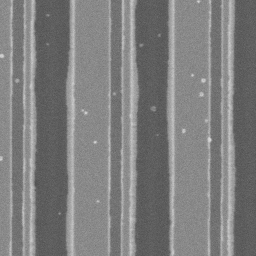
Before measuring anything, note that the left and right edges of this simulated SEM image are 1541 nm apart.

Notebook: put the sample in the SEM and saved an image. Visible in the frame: lines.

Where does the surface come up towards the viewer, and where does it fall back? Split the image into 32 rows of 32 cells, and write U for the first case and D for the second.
UUUUDDDDDUUUUUUUUDDDDUUUUUUUUDDD
UUUUDDDDDUUUUUUUUDDDDUUUUUUUUDDD
UUUUDDDDDUUUUUUUUDDDDUUUUUUUUDDD
UUUUDDDDDUUUUUUUUDDDDUUUUUUUUDDD
UUUUDDDDDUUUUUUUUDDDDUUUUUUUUDDD
UUUUDDDDDUUUUUUUUDDDDUUUUUUUUDDD
UUUUDDDDDUUUUUUUUDDDDUUUUUUUUDDD
UUUUDDDDDUUUUUUUUDDDDUUUUUUUUDDD
UUUUDDDDDUUUUUUUUDDDDUUUUUUUUDDD
UUUUDDDDDUUUUUUUUDDDDUUUUUUUUDDD
UUUUDDDDDUUUUUUUUDDDDUUUUUUUUDDD
UUUUDDDDDUUUUUUUUDDDDUUUUUUUUDDD
UUUUDDDDDUUUUUUUUDDDDUUUUUUUUDDD
UUUUDDDDDUUUUUUUUDDDDUUUUUUUUDDD
UUUUDDDDDUUUUUUUUDDDDUUUUUUUUDDD
UUUUDDDDDUUUUUUUUDDDDUUUUUUUUDDD
UUUUDDDDDUUUUUUUUDDDDUUUUUUUUDDD
UUUUDDDDDUUUUUUUUDDDDUUUUUUUUDDD
UUUUDDDDDUUUUUUUUDDDDUUUUUUUUDDD
UUUUDDDDDUUUUUUUUDDDDUUUUUUUUDDD
UUUUDDDDDUUUUUUUUDDDDUUUUUUUUDDD
UUUUDDDDDUUUUUUUUDDDDUUUUUUUUDDD
UUUUDDDDDUUUUUUUUDDDDUUUUUUUUDDD
UUUUDDDDDUUUUUUUUDDDDUUUUUUUUDDD
UUUUDDDDDUUUUUUUUDDDDUUUUUUUUDDD
UUUUDDDDDUUUUUUUUDDDDUUUUUUUUDDD
UUUUDDDDDUUUUUUUUDDDDUUUUUUUUDDD
UUUUDDDDDUUUUUUUUDDDDUUUUUUUUDDD
UUUUDDDDDUUUUUUUDDDDDUUUUUUUUDDD
UUUUDDDDDUUUUUUUDDDDDUUUUUUUUDDD
UUUUDDDDDUUUUUUUUDDDDUUUUUUUUDDD
UUUUDDDDDUUUUUUUUDDDDUUUUUUUUDDD